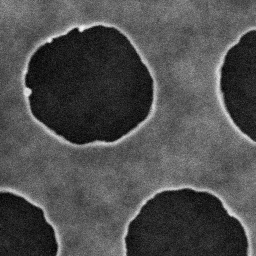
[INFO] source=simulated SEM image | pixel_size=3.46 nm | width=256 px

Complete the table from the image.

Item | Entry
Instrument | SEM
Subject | holes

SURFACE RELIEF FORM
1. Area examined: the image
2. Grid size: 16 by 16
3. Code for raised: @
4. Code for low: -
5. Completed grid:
@@@@@@@@@@@@@@@@
@@@@@@@@@@@@@@@@
@@@-----@@@@@@@-
@@-------@@@@@--
@@-------@@@@@--
@@--------@@@@--
@@--------@@@@--
@@-------@@@@@@-
@@@@----@@@@@@@-
@@@@@@@@@@@@@@@@
@@@@@@@@@@@@@@@@
@@@@@@@@@@@@@@@@
--@@@@@@@-----@@
---@@@@@-------@
---@@@@@-------@
----@@@@-------@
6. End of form